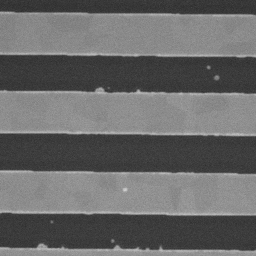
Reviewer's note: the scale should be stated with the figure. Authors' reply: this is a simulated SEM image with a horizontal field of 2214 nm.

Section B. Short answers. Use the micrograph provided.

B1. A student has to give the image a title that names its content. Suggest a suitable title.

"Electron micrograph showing lines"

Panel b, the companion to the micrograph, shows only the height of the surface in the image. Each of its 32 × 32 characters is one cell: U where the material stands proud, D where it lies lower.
DDDDDDDDDDDDDDDDDDDDDDDDDDDDDDDD
DDDDDDDDDDDDDDDDDDDDDDDDDDDDDDDD
UUUUUUUUUUUUUUUUUUUUUUUUUUUUUUUU
UUUUUUUUUUUUUUUUUUUUUUUUUUUUUUUU
UUUUUUUUUUUUUUUUUUUUUUUUUUUUUUUU
UUUUUUUUUUUUUUUUUUUUUUUUUUUUUUUU
UUUUUUUUUUUUUUUUUUUUUUUUUUUUUUUU
DDDDDDDDDDDDDDDDDDDDDDDDDDDDDDDD
DDDDDDDDDDDDDDDDDDDDDDDDDDDDDDDD
DDDDDDDDDDDDDDDDDDDDDDDDDDDDDDDD
DDDDDDDDDDDDDDDDDDDDDDDDDDDDDDDD
UUUUUUUUUUUDDDDDDDDDDDDDDDDDDDDD
UUUUUUUUUUUUUUUUUUUUUUUUUUUUUUUU
UUUUUUUUUUUUUUUUUUUUUUUUUUUUUUUU
UUUUUUUUUUUUUUUUUUUUUUUUUUUUUUUU
UUUUUUUUUUUUUUUUUUUUUUUUUUUUUUUU
UUUUUUUUUUUUUUUUUUUUUUUUUUUUUUUU
DDDDDDDDDDDDDDDDDDDDDDDDDDDDDDDD
DDDDDDDDDDDDDDDDDDDDDDDDDDDDDDDD
DDDDDDDDDDDDDDDDDDDDDDDDDDDDDDDD
DDDDDDDDDDDDDDDDDDDDDDDDDDDDDDDD
UUUUDDDDDDDDDDDDDDDDDDDDDDDDDDDD
UUUUUUUUUUUUUUUUUUUUUUUUUUUUUUUU
UUUUUUUUUUUUUUUUUUUUUUUUUUUUUUUU
UUUUUUUUUUUUUUUUUUUUUUUUUUUUUUUU
UUUUUUUUUUUUUUUUUUUUUUUUUUUUUUUU
UUUUUUUUUUUUUUUUUUUUUUUUUUUUUUUU
DDDDDDDDDDDDDDDDDDDDDDDDDDDDDDDD
DDDDDDDDDDDDDDDDDDDDDDDDDDDDDDDD
DDDDDDDDDDDDDDDDDDDDDDDDDDDDDDDD
DDDDDDDDDDDDDDDDDDDDDDDDDDDDDDDD
UUUUUUUUUUUUUUUUUUUUUUUUUUUUUUUU